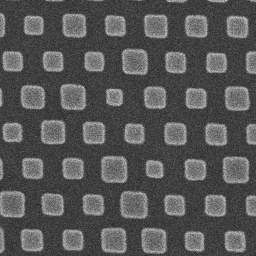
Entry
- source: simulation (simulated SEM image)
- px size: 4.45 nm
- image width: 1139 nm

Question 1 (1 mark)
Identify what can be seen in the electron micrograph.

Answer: a regular array of raised bodies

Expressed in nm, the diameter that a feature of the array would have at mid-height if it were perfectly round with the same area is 99.7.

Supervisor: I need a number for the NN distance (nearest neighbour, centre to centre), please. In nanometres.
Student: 180